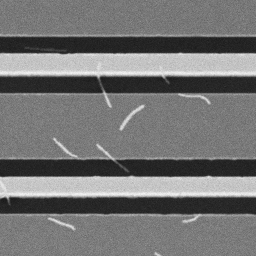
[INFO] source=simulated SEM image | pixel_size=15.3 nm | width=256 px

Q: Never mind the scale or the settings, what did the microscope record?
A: lines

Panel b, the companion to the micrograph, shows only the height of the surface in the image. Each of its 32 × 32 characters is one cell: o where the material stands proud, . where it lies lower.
oooooooooooooooooooooooooooooooo
oooooooooooooooooooooooooooooooo
oooooooooooooooooooooooooooooooo
oooooooooooooooooooooooooooooooo
oooooooooooooooooooooooooooooooo
................................
................................
oooooooooooooooooooooooooooooooo
oooooooooooooooooooooooooooooooo
............o.......o...........
................................
................................
oooooooooooooooooooooooooooooooo
oooooooooooooooooooooooooooooooo
oooooooooooooooooooooooooooooooo
oooooooooooooooooooooooooooooooo
oooooooooooooooooooooooooooooooo
oooooooooooooooooooooooooooooooo
oooooooooooooooooooooooooooooooo
oooooooooooooooooooooooooooooooo
................................
................................
oooooooooooooooooooooooooooooooo
oooooooooooooooooooooooooooooooo
oooooooooooo.o..oo...oo.........
................................
................................
oooooooooooooooooooooooooooooooo
oooooooooooooooooooooooooooooooo
oooooooooooooooooooooooooooooooo
oooooooooooooooooooooooooooooooo
oooooooooooooooooooooooooooooooo